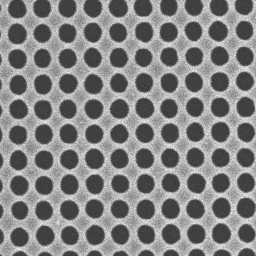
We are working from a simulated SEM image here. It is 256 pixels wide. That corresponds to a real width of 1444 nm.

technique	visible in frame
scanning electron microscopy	a regular array of holes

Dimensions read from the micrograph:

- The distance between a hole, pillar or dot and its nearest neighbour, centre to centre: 140 nm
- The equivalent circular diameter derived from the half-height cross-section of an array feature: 106 nanometers